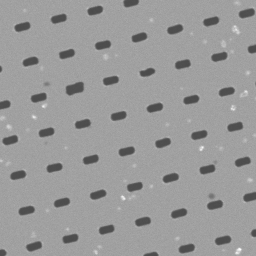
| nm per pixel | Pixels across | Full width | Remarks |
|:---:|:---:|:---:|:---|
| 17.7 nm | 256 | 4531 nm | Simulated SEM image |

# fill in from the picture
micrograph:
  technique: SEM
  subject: a regular array of holes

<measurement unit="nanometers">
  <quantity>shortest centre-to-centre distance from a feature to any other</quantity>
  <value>634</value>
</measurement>